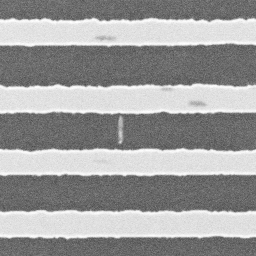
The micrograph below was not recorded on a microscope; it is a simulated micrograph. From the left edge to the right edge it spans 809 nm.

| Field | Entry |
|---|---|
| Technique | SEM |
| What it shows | lines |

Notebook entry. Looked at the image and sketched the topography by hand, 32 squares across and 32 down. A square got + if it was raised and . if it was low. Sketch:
................................
................................
.+...+.....+......++.........+.+
++++++++++++++++++++++++++++++++
++++++++++++++++++++++++++++++++
+++++++++++++++++++++++++++....+
................................
................................
................................
................................
................................
++++++++++++++++++++++++++++++++
++++++++++++++++++++++++++++++++
++++++++++++++++++++++++++++++++
................................
................................
................................
................................
................................
++++++++++++++++++++++++++++++++
++++++++++++++++++++++++++++++++
++++++++++++++++++++++++++++++++
................................
................................
................................
................................
++++++++++++++++++.++++++++++.++
++++++++++++++++++++++++++++++++
++++++++++++++++++++++++++++++++
+++++++++++++++++++++++++++.++++
................................
................................